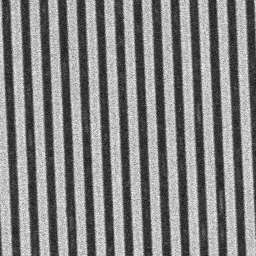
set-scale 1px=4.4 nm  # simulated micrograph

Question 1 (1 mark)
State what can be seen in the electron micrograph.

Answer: parallel lines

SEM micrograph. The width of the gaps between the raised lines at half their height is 42.3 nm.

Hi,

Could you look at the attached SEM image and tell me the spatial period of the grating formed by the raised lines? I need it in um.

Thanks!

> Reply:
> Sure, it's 0.0825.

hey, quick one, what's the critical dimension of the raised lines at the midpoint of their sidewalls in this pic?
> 0.0423 µm